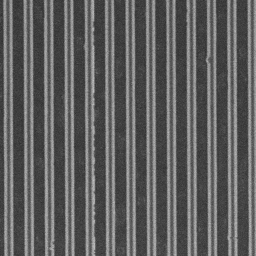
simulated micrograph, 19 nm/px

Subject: parallel lines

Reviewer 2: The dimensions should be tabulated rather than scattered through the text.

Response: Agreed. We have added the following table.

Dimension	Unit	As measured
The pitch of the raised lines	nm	387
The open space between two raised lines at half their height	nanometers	273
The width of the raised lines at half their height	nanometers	126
